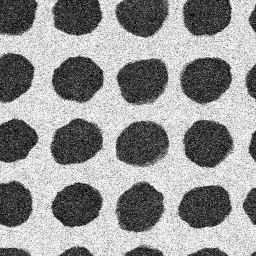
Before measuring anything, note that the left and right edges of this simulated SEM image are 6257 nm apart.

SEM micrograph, a regular array of holes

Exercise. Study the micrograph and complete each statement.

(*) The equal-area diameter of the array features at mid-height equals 1.18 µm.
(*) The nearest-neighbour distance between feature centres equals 1540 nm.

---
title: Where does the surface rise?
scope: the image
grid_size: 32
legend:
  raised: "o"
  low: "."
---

.....oo.....ooo......oo......ooo
....ooo......o.......oo......ooo
....ooo......oo......oo......oo.
....ooo.....ooo.....ooo.....oooo
ooooooooooooooooo..ooooooooooooo
oooooooooooooooooooooooooooooooo
oooooooooooooooooooooooooooooooo
...ooooo...ooooooo..oooo....oooo
....ooo......oo......oo......ooo
....ooo......oo......oo......oo.
....ooo......oo......oo......oo.
...oooo.....ooo.....ooo.....ooo.
..oooooo...ooooo...ooooo...ooooo
oooooooooooooooooooooooooooooooo
oooooooooooooooooooooooooooooooo
...ooooo....oooo....oooo....oooo
....ooo......oo......oo......ooo
.....oo......oo......oo......oo.
....oo.......o.......oo......oo.
...oooo.....ooo......oo.....ooo.
oooooooo..oooooo...ooooo...ooooo
oooooooooooooooooooooooooooooooo
oooooooooooooooooooooooooooooooo
...ooooo....oooo...ooooo....oooo
....ooo......oo.....ooo......oo.
....ooo......oo.....oo.......o..
....ooo.....ooo.....oo.......oo.
...oooo.....ooo.....ooo.....ooo.
ooooooooooooooo....ooooo.ooooooo
oooooooooooooooooooooooooooooooo
oooooooooooooooooooooooooooooooo
...ooooo...ooooo....ooooo...oooo